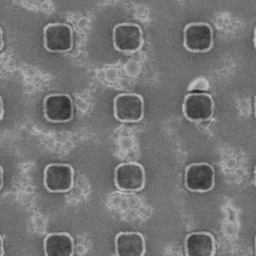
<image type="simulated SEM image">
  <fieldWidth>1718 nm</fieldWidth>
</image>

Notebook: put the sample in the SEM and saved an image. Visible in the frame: a regular array of raised bodies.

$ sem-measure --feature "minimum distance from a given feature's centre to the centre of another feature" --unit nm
467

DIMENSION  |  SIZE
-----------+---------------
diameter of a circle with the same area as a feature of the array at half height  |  0.199 microns